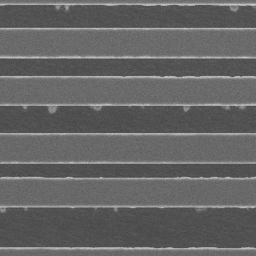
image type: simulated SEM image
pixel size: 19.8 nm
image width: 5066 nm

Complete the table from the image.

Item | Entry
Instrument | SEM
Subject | lines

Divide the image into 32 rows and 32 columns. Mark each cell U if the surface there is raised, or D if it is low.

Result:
UUUUUUUUUUUUUUUUUUUUUUUUUUUUUUUU
DDDDDDDDDDDDDDDDDDDDDDDDDDDDDDDD
DDDDDDDDDDDDDDDDDDDDDDDDDDDDDDDD
DDDDDDDDDDDDDDDDDDDDDDDDDDDDDDDD
UUUUUUUUUUUUUUUUUUUUUUUUUUUUUUUU
UUUUUUUUUUUUUUUUUUUUUUUUUUUUUUUU
UUUUUUUUUUUUUUUUUUUUUUUUUUUUUUUU
DDDDDDDDDDDDDDDDDDDDDDDDDDDDDDDD
DDDDDDDDDDDDDDDDDDDDDDDDDDDDDDDD
DDDDDDDDDDDDDDDDDDDDDDDDDDDDDDDD
UUUUUUUUUUUUUUUUUUUUUUUUUUUUUUUU
UUUUUUUUUUUUUUUUUUUUUUUUUUUUUUUU
UUUUUUUUUUUUUUUUUUUUUUUUUUUUUUUU
DDDDDDDDDDDDDDDDDDDDDDDDDDDDDDDD
DDDDDDDDDDDDDDDDDDDDDDDDDDDDDDDD
DDDDDDDDDDDDDDDDDDDDDDDDDDDDDDDD
DDDDDDDDDDDDDDDDDDDDDDDDDDDDDDDD
UUUUUUUUUUUUUUUUUUUUUUUUUUUUUUUU
UUUUUUUUUUUUUUUUUUUUUUUUUUUUUUUU
UUUUUUUUUUUUUUUUUUUUUUUUUUUUUUUU
DDDDDDDDDDDDDDDDDDDDDDDDDDDDDDDD
DDDDDDDDDDDDDDDDDDDDDDDDDDDDDDDD
UUUUUUUUUUUUUUUUUUUUUUUUUUUUUUUU
UUUUUUUUUUUUUUUUUUUUUUUUUUUUUUUU
UUUUUUUUUUUUUUUUUUUUUUUUUUUUUUUU
UUUUUUUUUUUUUUUUUUUUUUUUUUUUUUUU
DDDDDDDDDDDDDDDDDDDDDDDDDDDDDDDD
DDDDDDDDDDDDDDDDDDDDDDDDDDDDDDDD
DDDDDDDDDDDDDDDDDDDDDDDDDDDDDDDD
DDDDDDDDDDDDDDDDDDDDDDDDDDDDDDDD
DDDDDDDDDDDDDDDDDDDDDDDDDDDDDDDD
UUUUUUUUUUUUUUUUUUUUUUUUUUUUUUUU